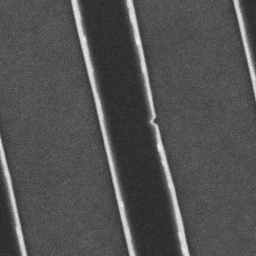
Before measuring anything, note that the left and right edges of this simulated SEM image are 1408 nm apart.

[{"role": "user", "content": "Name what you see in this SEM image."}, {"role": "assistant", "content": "one or a few lines or trenches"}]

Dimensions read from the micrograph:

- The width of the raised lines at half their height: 54.9 px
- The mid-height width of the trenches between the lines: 566 nm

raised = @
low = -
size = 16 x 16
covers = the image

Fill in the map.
-----@@@-------@
-----@@@-------@
-----@@@@------@
-----@@@@------@
------@@@-------
------@@@-------
------@@@-------
------@@@@------
-------@@@------
-------@@@------
-------@@@------
@------@@@@-----
@------@@@@-----
@-------@@@-----
@-------@@@-----
@-------@@@@----